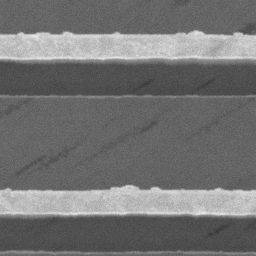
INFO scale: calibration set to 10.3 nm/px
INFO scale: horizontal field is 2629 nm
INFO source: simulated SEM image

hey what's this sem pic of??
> lines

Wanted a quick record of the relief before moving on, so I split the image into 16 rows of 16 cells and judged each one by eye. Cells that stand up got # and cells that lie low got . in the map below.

################
################
################
################
................
................
################
################
################
################
################
################
################
................
................
................